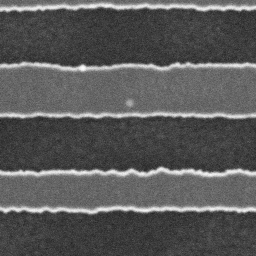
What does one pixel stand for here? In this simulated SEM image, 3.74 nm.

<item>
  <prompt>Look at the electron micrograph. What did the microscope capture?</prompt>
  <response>lines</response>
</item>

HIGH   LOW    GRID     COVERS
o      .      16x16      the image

ooooo..o....oooo
................
................
................
oooooooooooooooo
oooooooooooooooo
oooooooooooooooo
................
................
................
................
oooooooooooooooo
oooooooooooooooo
................
................
................